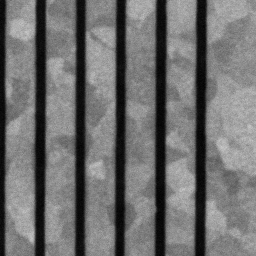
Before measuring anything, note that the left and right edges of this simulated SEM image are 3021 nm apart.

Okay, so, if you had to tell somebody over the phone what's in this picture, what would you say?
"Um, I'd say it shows parallel lines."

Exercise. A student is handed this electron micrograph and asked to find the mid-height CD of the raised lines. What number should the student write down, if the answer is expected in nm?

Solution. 342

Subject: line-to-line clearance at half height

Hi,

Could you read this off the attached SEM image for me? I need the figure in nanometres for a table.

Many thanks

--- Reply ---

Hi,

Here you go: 128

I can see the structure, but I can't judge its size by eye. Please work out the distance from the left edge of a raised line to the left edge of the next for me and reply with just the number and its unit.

473 nanometres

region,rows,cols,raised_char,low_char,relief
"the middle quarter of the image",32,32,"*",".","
***...*******...*******...******
***...*******...*******...******
***...*******...*******...******
***...*******...*******...******
***...*******...*******...******
***...*******...*******...******
***...*******...*******...******
**....*******...*******...******
***...*******...*******...******
***...*******...*******...******
***...*******...*******...******
***...*******...*******...******
***...*******...*******...******
***...*******...*******...******
**....*******...*******...******
***...*******...*******...******
***...*******...*******...******
***...*******...*******...******
***...*******...*******...******
***...*******...*******...******
***...*******...*******...******
***...*******...*******...******
***...*******...*******...******
***...*******...*******...******
***...*******...*******...******
***...*******...*******...******
***...*******...*******...******
***...*******...*******...******
***...*******...*******...******
***...*******...*******...******
***...*******...*******...******
***...*******...*******...******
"